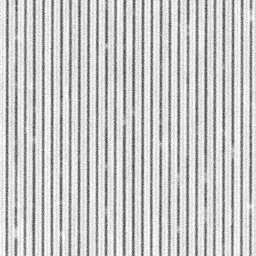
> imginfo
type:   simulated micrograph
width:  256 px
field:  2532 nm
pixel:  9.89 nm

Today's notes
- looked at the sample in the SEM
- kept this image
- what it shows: parallel lines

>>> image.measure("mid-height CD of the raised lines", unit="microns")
0.0371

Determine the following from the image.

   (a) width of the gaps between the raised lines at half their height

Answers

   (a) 0.047 microns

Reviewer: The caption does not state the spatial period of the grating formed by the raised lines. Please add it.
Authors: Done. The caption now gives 89.1 nm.